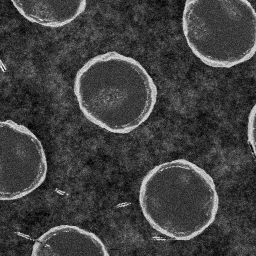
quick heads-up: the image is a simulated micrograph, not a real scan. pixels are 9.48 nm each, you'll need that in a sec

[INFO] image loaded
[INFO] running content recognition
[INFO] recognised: raised bodies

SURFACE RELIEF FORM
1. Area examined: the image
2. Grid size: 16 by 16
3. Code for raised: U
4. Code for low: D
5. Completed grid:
DUUUUDDDDDDDUUUU
DDDUDDDDDDDDUUUU
DDDDDDDDDDDDUUUU
DDDDDDDDDDDDDUUD
DDDDDUUUUDDDDDDD
DDDDDUUUUUDDDDDD
DDDDDUUUUUDDDDDD
DDDDDDUUUDDDDDDD
UUDDDDDDDDDDDDDD
UUUDDDDDDDDDDDDD
UUUDDDDDDDUUDDDD
UUDDDDDDDUUUUDDD
DDDDDDDDDUUUUDDD
DDDDDDDDDUUUUDDD
DDDUUDDDDDUUDDDD
DDUUUUDDDDDDDDDD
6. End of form